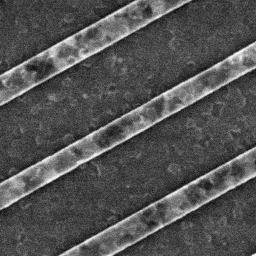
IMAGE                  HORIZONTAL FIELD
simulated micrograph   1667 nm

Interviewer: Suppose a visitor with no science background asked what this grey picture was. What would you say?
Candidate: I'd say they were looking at one or a few lines or trenches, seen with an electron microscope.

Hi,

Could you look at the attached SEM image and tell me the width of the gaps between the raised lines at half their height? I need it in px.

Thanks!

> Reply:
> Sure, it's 69.4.